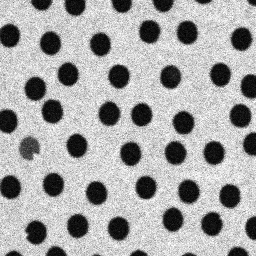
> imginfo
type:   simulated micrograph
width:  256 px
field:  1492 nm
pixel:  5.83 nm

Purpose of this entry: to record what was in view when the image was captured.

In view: a regular array of holes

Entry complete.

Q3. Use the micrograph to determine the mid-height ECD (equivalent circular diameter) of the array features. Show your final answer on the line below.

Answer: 22.5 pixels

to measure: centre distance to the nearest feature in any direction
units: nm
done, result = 218